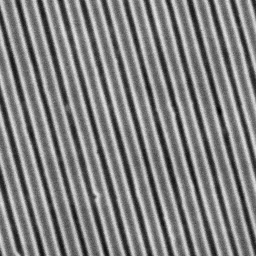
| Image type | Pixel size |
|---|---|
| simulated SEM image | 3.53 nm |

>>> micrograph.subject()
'parallel lines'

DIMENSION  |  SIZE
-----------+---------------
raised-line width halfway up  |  45.6 nanometres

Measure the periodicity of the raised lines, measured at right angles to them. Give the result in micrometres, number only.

0.0733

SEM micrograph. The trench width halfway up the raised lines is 27.7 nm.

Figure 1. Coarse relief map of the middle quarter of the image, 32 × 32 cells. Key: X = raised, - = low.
XX--XXXX--XXX--XXXX-XXXX--XXX--X
XXX--XXX--XXXX--XXX--XXX--XXXX-X
XXX--XXX--XXXX--XXX--XXXX--XXX--
XXX--XXXX--XXX--XXXX-XXXX--XXX--
XXXX--XXX--XXX--XXXX--XXX--XXX--
XXXX--XXX--XXXX--XXX--XXX--XXXX-
-XXX--XXX---XXX--XXX--XXXX--XXX-
-XXX--XXXX--XXX--XXXX-XXXX--XXX-
-XXXX-XXXX--XXX--XXXX--XXX--XXX-
-XXXX--XXX--XXXX--XXX--XXX--XXXX
--XXX--XXXX--XXX--XXX--XXXX--XXX
--XXX--XXXX--XXX--XXXX-XXXX--XXX
--XXXX--XXX--XXX---XXX--XXX--XXX
X--XXX--XXX--XXXX--XXX--XXXX--XX
X--XXX--XXXX--XXX--XXX--XXXX--XX
X--XXX--XXXX--XXX--XXXX--XXX--XX
X--XXXX--XXX--XXX---XXX--XXX--XX
XX--XXX--XXX--XXXX--XXX--XXXX--X
XX--XXX--XXXX--XXX--XXX--XXXX--X
XX--XXXX-XXXX--XXX--XXXX--XXX--X
XX---XXX--XXX--XXXX-XXXX--XXX--X
XXX--XXX--XXX---XXX--XXX--XXXX--
XXX--XXX--XXXX--XXX--XXX---XXX--
XXX--XXXX--XXX--XXX--XXXX--XXX--
XXXX--XXX--XXX--XXXX-XXXX--XXX--
XXXX--XXX--XXXX--XXX--XXX--XXXX-
-XXX--XXX---XXX--XXX--XXXX--XXX-
-XXX--XXXX--XXX--XXX--XXXX--XXX-
-XXXX--XXX--XXX--XXXX--XXX--XXX-
-XXXX--XXX--XXXX--XXX--XXX--XXXX
--XXX--XXX---XXX--XXX--XXXX--XXX
--XXX--XXXX--XXX--XXX--XXXX--XXX